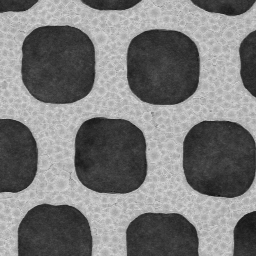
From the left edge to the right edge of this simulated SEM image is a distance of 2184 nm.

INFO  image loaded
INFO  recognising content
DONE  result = holes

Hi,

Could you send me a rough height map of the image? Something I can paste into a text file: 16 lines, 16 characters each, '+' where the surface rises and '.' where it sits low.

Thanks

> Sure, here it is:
..++++..+++++...
++++++++++++++++
++....++....+++.
+.....++....+++.
+.....++....+++.
++....++....+++.
+++.++++++.+++++
.+++++..++++++++
..+++....+++....
..+++....++.....
..+++....++.....
..+++....+++....
++++++++++++++++
++...++++..++++.
+.....++....+++.
+.....++....+++.